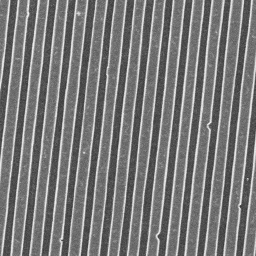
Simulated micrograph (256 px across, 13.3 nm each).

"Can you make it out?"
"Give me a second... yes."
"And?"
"parallel lines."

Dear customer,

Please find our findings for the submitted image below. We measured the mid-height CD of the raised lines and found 146 nm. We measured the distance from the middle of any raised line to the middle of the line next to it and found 257 nm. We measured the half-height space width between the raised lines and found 0.112 micrometres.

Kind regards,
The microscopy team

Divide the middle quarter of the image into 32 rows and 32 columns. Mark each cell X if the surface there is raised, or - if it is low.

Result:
-XXX--XXX--XXX--XXX--XXX--XX---X
-XXX--XXX--XXX--XXX--XX---XX---X
-XXX--XXX--XXX--XX---XX---XX--XX
-XXX--XXX--XX---XX---XX---XX--XX
-XXX--XX---XX---XX---XX--XXX--XX
-XXX--XX---XX---XX--XXX--XXX--XX
-XX---XX---XX--XXX--XXX--XXX--XX
-XX---XX--XXX--XXX--XXX--XXX--XX
XXX--XXX--XXX--XXX--XXX--XXX--XX
XXX--XXX--XXX--XXX--XXX--XX---XX
XXX--XXX--XXX--XXX--XX---XX---XX
XXX--XXX--XXX--XX---XX---XX---XX
XXX--XXX--XX---XX---XX---XX--XXX
XXX--XXX--XX---XX---XX--XXX--XXX
XXX--XX---XX---XX--XXX--XXX--XXX
XX---XX---XX--XXX--XXX--XXX--XXX
XX---XX--XXX--XXX--XXX--XXX--XXX
XX---XX--XXX--XXX--XXX--XXX--XX-
XX--XXX--XXX--XXX--XXX--XX---XX-
XX--XXX--XXX--XXX--XX---XX---XX-
XX--XXX--XXX--XXX--XX---XX---XX-
XX--XXX--XXX--XX---XX---XX--XXX-
XX--XXX--XX---XX---XX--XXX--XXX-
X---XX---XX---XX--XXX--XXX--XXX-
X---XX---XX---XX--XXX--XXX--XXX-
X---XX---XX--XXX--XXX--XXX--XXX-
X--XXX--XXX--XXX--XXX--XXX--XX--
X--XXX--XXX--XXX--XXX--XXX--XX--
X--XXX--XXX--XXX--XXX--XX---XX--
X--XXX--XXX--XXX--XX---XX---XX--
X--XXX--XXX--XX---XX---XX--XXX--
X--XXX--XX---XX---XX--XXX--XXX--